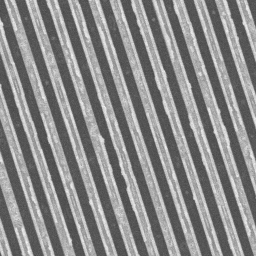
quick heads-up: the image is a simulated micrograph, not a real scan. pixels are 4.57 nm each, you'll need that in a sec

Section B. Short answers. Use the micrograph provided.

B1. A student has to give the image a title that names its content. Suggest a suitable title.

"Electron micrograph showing parallel lines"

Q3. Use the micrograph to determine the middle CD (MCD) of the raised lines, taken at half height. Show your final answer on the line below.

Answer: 46.3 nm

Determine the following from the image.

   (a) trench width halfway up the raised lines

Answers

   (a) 0.0463 um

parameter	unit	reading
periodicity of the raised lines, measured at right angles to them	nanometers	91.7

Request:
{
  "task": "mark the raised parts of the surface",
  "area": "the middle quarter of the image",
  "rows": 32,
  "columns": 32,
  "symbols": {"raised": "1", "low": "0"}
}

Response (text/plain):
01110011100111000110001110011100
01110001100011000111001110001100
00110001110011100111000110001110
00111001110011100011000111001110
00111000110001100011100111000110
00011000110001110011100111000111
00011100111001110001100011100111
10011100111000110001110011100011
10011100011000111001110001100011
10001100011100111000110001100011
10001110011100011000110001110011
11001110001100011000111001110001
11000110001110011100111000110001
11000111001110011100011000111001
11100111001110001100011100111001
11100011000111001110011100011000
01100011100111001110001100011100
01110011100111000110001110011100
01110001110011100111001110001100
00110001110011100111000110001110
00111001110011100011000111001110
00111000111001110011100111000110
00011000111001110011100011000111
00011100111000110001100011100111
10011100011000111001110011100011
10001100011100111001110001100011
10001110011100111000110001110011
11001110001100111100111001110001
11000110001110011100111000110001
11000111001110011100011000111001
11100111000110001100011100111000
11100011000110001110011100011000